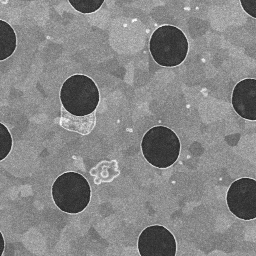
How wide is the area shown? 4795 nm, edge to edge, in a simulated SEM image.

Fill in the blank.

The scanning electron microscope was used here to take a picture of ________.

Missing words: holes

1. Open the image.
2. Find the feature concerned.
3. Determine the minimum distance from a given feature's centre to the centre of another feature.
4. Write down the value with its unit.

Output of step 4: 1810 nm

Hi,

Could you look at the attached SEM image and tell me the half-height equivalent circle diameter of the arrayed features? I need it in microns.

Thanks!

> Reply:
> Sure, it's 0.759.